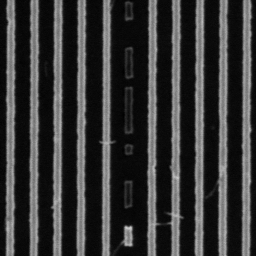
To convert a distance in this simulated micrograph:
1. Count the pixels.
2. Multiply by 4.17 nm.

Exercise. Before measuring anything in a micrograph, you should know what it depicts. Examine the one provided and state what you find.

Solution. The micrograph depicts parallel lines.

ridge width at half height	30.2	nanometres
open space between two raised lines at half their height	68.8	nanometers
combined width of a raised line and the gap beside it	98.5	nm